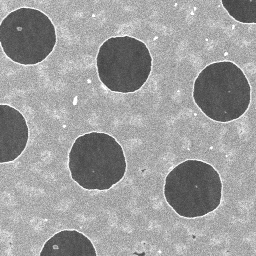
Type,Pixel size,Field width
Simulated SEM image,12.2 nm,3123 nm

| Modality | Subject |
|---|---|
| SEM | holes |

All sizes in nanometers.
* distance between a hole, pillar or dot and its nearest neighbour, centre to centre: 1230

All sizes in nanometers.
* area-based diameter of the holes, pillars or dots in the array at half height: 708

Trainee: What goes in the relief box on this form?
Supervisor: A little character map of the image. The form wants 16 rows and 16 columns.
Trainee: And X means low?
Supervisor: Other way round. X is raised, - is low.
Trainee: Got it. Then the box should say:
XXXXXXXXXXXXXX--
---XXXXXXXXXXXXX
---XXXX--XXXXXXX
---XXX---XXXXXXX
XXXXXX---XXXX--X
XXXXXXX--XXX----
XXXXXXXXXXXX----
--XXXXXXXXXXX--X
--XXX--XXXXXXXXX
-XXX----XXXXXXXX
XXXX----XXX--XXX
XXXXX--XXX----XX
XXXXXXXXXX----XX
XXXXXXXXXXX--XXX
XXXX-XXXXXXXXXXX
XXX---XXXXXXXXXX